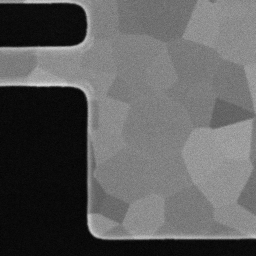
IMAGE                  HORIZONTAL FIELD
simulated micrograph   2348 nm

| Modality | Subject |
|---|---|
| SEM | wiring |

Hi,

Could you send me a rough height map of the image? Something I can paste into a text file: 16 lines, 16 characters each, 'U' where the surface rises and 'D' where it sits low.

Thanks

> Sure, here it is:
DDDDDUUUUUUUUUUU
DDDDDDUUUUUUUUUU
DDDDDUUUUUUUUUUU
UUUUUUUUUUUUUUUU
UUUUUUUUUUUUUUUU
DDDDDUUUUUUUUUUU
DDDDDDUUUUUUUUUU
DDDDDDUUUUUUUUUU
DDDDDDUUUUUUUUUU
DDDDDDUUUUUUUUUU
DDDDDDUUUUUUUUUU
DDDDDDUUUUUUUUUU
DDDDDDUUUUUUUUUU
DDDDDDUUUUUUUUUU
DDDDDDUUUUUUUUUU
DDDDDDDDDDDDDDDD